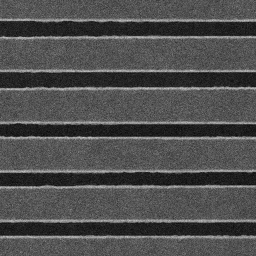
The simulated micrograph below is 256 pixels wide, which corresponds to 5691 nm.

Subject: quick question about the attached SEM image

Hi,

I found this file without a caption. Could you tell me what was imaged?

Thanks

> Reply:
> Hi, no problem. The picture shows lines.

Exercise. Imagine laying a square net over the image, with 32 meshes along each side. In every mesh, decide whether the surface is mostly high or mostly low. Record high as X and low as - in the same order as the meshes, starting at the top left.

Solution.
XXXXXXXXXXXXXXXXXXXXXXXXXXXXXXXX
XXXXXXXXXXXXXXXXXXXXXXXXXXXXXXXX
XXXXXXXXXXXXXXXXXXXXXXXXXXXXXXXX
--------------------------------
--------------------------------
XXXXXXXXXXXXXXXXXXXXXXXXXXXXXXXX
XXXXXXXXXXXXXXXXXXXXXXXXXXXXXXXX
XXXXXXXXXXXXXXXXXXXXXXXXXXXXXXXX
XXXXXXXXXXXXXXXXXXXXXXXXXXXXXXXX
--------------------------------
--------------------------------
XXXXXXXXXXXXXXXXXXXXXXXXXXXXXXXX
XXXXXXXXXXXXXXXXXXXXXXXXXXXXXXXX
XXXXXXXXXXXXXXXXXXXXXXXXXXXXXXXX
XXXXXXXXXXXXXXXXXXXXXXXXXXXXXXXX
--------------------------------
--------------------------------
XXXXXXXXXXXXXXXXXXXXXXXXXXXXXXXX
XXXXXXXXXXXXXXXXXXXXXXXXXXXXXXXX
XXXXXXXXXXXXXXXXXXXXXXXXXXXXXXXX
XXXXXXXXXXXXXXXXXXXXXXXXXXXXXXXX
XXXX-X---------------X----------
--------------------------------
XXXXXXXXXXXXXXXXXXXXXXXXXXXXXXXX
XXXXXXXXXXXXXXXXXXXXXXXXXXXXXXXX
XXXXXXXXXXXXXXXXXXXXXXXXXXXXXXXX
XXXXXXXXXXXXXXXXXXXXXXXXXXXXXXXX
XXXXXXXXXXXXXXXXXXXXXXXXXXXXXXXX
--------------------------------
--------------------------------
XXXXXXXXXXXXXXXXXXXXXXXXXXXXXXXX
XXXXXXXXXXXXXXXXXXXXXXXXXXXXXXXX